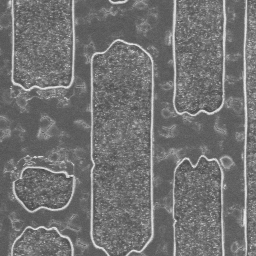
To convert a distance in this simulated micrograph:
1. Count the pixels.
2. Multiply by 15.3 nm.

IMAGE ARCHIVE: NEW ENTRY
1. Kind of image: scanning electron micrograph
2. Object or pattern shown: one or a few lines or trenches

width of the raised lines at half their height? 348 nanometres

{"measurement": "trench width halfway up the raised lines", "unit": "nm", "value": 875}